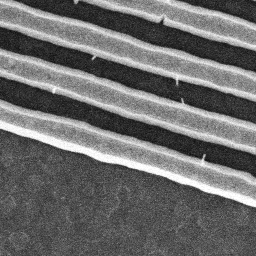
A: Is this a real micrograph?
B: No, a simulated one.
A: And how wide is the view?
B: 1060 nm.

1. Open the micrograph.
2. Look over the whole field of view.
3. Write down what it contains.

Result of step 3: parallel lines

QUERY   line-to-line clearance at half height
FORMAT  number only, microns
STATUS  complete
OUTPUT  0.0986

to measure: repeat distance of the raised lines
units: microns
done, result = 0.202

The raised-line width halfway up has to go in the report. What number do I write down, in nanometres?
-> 102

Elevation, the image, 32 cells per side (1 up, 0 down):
11000000000001111111111000000000
11111000000000001111111111100000
11111111100000000001111111111100
00111111111100000000000111111111
00000111111111100000000000111111
00000000111111111100000000000011
10000000000111111111110000000000
11111000000000111111111110000000
11111111000000000011111111111000
01111111111000000000011111111111
00001111111111000000000001111111
00000000111111111000000000000111
00000000001111111111000000000000
11000000000001111111111100000000
11111100000000001111111111110000
11111111110000000000111111111110
00111111111110000000000111111111
00000111111111111000000000111111
00000000011111111111000000000011
00000000000011111111111000000000
00000000000000001111111111000000
00000000000000000000111111111100
00000000000000000000001111111111
00000000000000000000000001111111
00000000000000000000000000000111
00000000000000000000000000000000
00000000000000000000000000000000
00000000000000000000000000000000
00000000000000000000000000000000
00000000000000000000000000000000
00000000000000000000000000000000
00000000000000000000000000000000